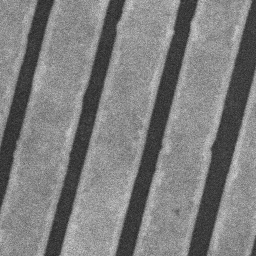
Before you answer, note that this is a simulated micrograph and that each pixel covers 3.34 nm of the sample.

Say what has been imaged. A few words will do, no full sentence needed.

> one or a few lines or trenches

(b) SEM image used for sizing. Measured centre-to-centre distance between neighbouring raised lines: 230 nm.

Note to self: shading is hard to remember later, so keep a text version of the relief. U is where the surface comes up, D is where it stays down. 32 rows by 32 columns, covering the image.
UUUUDDDUUUUUUDDDUUUUUUDDDUUUUUUD
UUUUDDDUUUUUUDDDUUUUUUDDDUUUUUUD
UUUUDDDUUUUUUDDUUUUUUUDDUUUUUUDD
UUUDDDUUUUUUDDDUUUUUUDDDUUUUUUDD
UUUDDDUUUUUUDDDUUUUUUDDDUUUUUUDD
UUUDDDUUUUUUDDDUUUUUUDDDUUUUUUDD
UUUDDDUUUUUUDDUUUUUUUDDUUUUUUDDD
UUDDDUUUUUUDDDUUUUUUDDDUUUUUUDDD
UUDDDUUUUUUDDDUUUUUUDDDUUUUUUDDD
UUDDDUUUUUUDDDUUUUUUDDDUUUUUDDDD
UUDDUUUUUUUDDUUUUUUDDDDUUUUUDDDD
UDDDUUUUUUDDDUUUUUUDDDUUUUUUDDDD
UDDDUUUUUUDDDUUUUUUDDDUUUUUUDDDU
UDDDUUUUUUDDDUUUUUUDDDUUUUUDDDDU
UDDDUUUUUUDDUUUUUUDDDDUUUUUDDDDU
DDDUUUUUUDDDUUUUUUDDDUUUUUUDDDDU
DDDUUUUUUDDDUUUUUUDDDUUUUUUDDDUU
DDDUUUUUUDDDUUUUUUDDDUUUUUDDDDUU
DDUUUUUUUDDUUUUUUUDDDUUUUUDDDDUU
DDUUUUUUDDDUUUUUUDDDUUUUUUDDDDUU
DDUUUUUUDDDUUUUUUDDDUUUUUUDDDUUU
DDUUUUUUDDDUUUUUUDDDUUUUUUDDDUUU
DDUUUUUUDDUUUUUUUDDUUUUUUDDDDUUU
DUUUUUUDDDUUUUUUDDDUUUUUUDDDUUUU
DUUUUUUDDDUUUUUUDDDUUUUUUDDDUUUU
DUUUUUUDDDUUUUUUDDDUUUUUUDDDUUUU
UUUUUUDDDUUUUUUDDDUUUUUUDDDDUUUU
UUUUUUDDDUUUUUUDDDUUUUUUDDDUUUUU
UUUUUUDDDUUUUUUDDDUUUUUUDDDUUUUU
UUUUUUDDDUUUUUUDDDUUUUUUDDDUUUUD
UUUUUDDDUUUUUUDDDUUUUUUDDDDUUUUD
UUUUUDDDUUUUUUDDDUUUUUUDDDUUUUUD